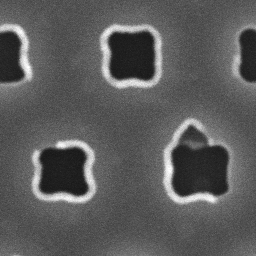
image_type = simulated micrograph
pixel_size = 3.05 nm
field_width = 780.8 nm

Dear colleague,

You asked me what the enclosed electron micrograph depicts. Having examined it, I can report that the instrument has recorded holes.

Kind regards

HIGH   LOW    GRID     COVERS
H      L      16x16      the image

HHHHHHHHHHHHHHHH
HHHHHHHHHHHHHHHH
LHHHHHHLLLHHHHHL
LHHHHHHLLLHHHHHL
LHHHHHHLLLHHHHHL
HHHHHHHHHHHHHHHH
HHHHHHHHHHHHHHHH
HHHHHHHHHHHHHHHH
HHHHHHHHHHHLLHHH
HHHLLHHHHHHLLLHH
HHHLLHHHHHHLLLHH
HHLLLHHHHHHLLLHH
HHHHHHHHHHHHHHHH
HHHHHHHHHHHHHHHH
HHHHHHHHHHHHHHHH
HHHHHHHHHHHHHHHH